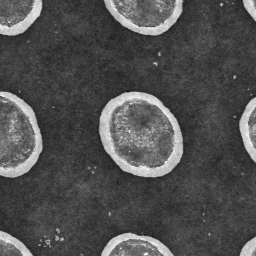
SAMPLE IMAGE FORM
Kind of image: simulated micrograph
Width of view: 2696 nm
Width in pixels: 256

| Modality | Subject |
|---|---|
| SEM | raised bodies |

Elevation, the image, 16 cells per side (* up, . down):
**.....****.....
*.......**......
................
................
................
................
*......***......
**.....****....*
**.....****....*
**.....****.....
*.......**......
................
................
................
................
*......***......